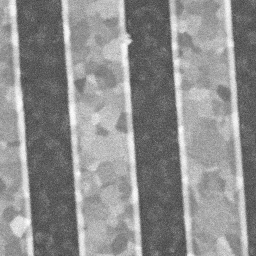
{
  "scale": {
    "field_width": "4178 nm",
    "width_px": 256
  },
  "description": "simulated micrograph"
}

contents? one or a few lines or trenches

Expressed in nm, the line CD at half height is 941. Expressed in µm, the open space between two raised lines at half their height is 0.808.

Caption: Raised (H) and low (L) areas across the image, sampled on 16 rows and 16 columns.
HLLLHHHHLLLHHHLL
HLLLHHHHLLLHHHLL
HLLLHHHHLLLHHHLL
HLLLHHHHLLLHHHLL
HLLLHHHHLLLHHHHL
HLLLHHHHLLLHHHHL
HLLLHHHHLLLHHHHL
HLLLLHHHLLLHHHHL
HLLLLHHHLLLHHHHL
HLLLLHHHLLLHHHHL
HHLLLHHHLLLHHHHL
HHLLLHHHLLLHHHHL
HHLLLHHHHLLLHHHL
HHLLLHHHHLLLHHHL
HHLLLHHHHLLLHHHL
HHLLLHHHHLLLHHHL